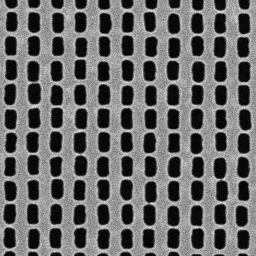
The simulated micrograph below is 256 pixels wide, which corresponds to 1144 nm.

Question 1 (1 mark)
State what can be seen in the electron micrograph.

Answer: a regular array of holes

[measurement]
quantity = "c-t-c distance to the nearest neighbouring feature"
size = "0.101 µm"